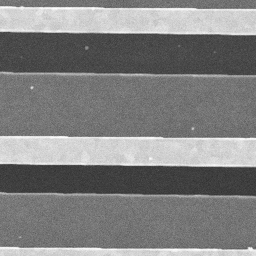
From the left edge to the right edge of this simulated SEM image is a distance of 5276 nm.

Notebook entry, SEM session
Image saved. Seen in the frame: lines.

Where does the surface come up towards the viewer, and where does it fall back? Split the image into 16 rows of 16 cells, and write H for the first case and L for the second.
HHHHHHHHHHHHHHHH
HHHHHHHHHHHHHHHH
LLLLLLLLLLLLLLLL
LLLLLLLLLLLLLLLL
LLLLLLLLLLLLLLLL
HHHHHHHHHHHHHHHH
HHHHHHHHHHHHHHHH
HHHHHHHHHHHHHHHH
HHHHHHHHHHHHHHHH
HHHHHHHHHHHHHHHH
LLLLLLLLLLLLLLLL
LLLLLLLLLLLLLLLL
HHHHHHHHHHHHHHHH
HHHHHHHHHHHHHHHH
HHHHHHHHHHHHHHHH
HHHHHHHHHHHHHHHH